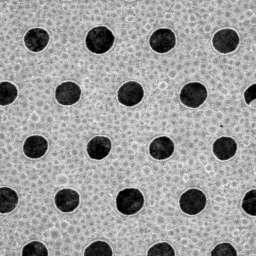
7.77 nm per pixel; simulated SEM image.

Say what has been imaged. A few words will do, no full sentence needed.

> a regular array of holes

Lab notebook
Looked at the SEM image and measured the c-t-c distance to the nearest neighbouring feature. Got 0.481 micrometres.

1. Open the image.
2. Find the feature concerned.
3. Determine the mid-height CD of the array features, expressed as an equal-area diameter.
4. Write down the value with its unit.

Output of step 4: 0.206 microns